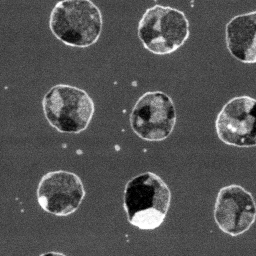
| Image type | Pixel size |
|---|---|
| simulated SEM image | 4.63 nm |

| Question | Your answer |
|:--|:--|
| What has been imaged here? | raised bodies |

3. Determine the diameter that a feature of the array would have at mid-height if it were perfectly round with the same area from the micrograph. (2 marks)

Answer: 221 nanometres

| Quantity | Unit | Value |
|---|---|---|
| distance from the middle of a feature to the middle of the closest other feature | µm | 0.391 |